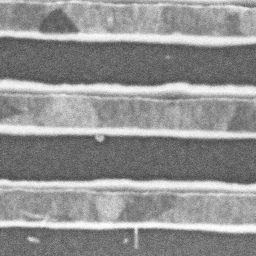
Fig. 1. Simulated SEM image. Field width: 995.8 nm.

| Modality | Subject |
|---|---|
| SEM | lines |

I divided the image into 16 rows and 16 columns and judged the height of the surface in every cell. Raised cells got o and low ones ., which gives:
oooooooooooooooo
oooooooooooooooo
................
................
................
ooo.......o.....
oooooooooooooooo
oooooooooooooooo
................
................
................
ooooooooo.......
oooooooooooooooo
oooooooooooooooo
................
................